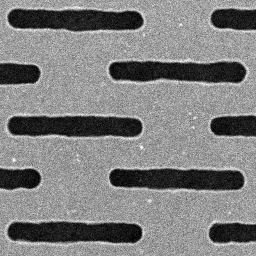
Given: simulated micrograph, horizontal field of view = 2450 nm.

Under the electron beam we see holes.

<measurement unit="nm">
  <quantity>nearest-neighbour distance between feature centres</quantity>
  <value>1020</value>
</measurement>